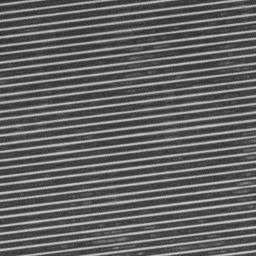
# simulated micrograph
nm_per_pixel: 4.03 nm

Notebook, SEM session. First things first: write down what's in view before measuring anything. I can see parallel lines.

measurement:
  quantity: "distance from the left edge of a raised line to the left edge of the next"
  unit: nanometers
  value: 32.7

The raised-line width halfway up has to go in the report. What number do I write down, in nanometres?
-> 9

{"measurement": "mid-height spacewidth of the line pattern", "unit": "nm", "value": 24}